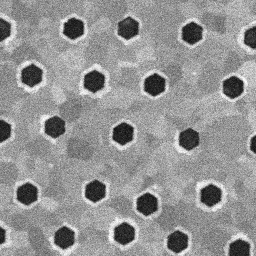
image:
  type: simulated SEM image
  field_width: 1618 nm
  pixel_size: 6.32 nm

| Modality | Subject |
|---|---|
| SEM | a regular array of holes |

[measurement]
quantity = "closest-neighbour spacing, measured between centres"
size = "356 nm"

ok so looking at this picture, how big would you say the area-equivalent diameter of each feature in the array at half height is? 0.143 microns